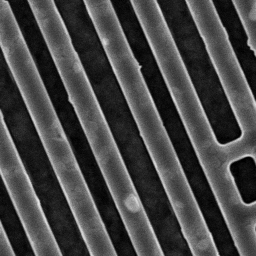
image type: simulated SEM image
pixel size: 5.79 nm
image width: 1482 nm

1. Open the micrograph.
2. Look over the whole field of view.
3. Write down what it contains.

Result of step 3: parallel lines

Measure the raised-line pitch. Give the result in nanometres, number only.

274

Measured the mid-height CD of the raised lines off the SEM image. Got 141 nanometers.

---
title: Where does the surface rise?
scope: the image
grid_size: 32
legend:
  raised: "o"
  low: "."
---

o...ooo....ooo..oooo...oooo..ooo
oo..ooo....ooo...ooo....ooo...oo
oo...ooo...oooo..oooo...ooo...oo
oo...ooo....ooo...ooo....ooo...o
ooo..oooo...oooo..oooo...ooo...o
ooo...ooo....ooo...ooo....ooo..o
oooo..oooo...oooo..ooo....ooo...
.ooo...ooo....ooo..oooo...oooo..
.oooo..ooo....oooo..ooo....ooo..
..ooo...ooo...oooo..oooo...oooo.
..ooo...ooo....ooo...ooo....ooo.
...ooo..oooo...oooo..oooo...ooo.
...ooo...ooo....ooo...ooo...oooo
...oooo..oooo...oooo..ooo....ooo
....ooo...ooo....ooo..oooo...ooo
o...oooo..ooo....ooo...ooo....oo
o....ooo...ooo....ooo..oooo...oo
oo...ooo...ooo....ooo...ooo..ooo
oo....ooo..oooo...oooo..oooooooo
oo....ooo...ooo....ooo...ooooooo
ooo...oooo..oooo...oooo..oooo...
ooo....ooo...ooo....ooo...ooo...
oooo...oooo..ooo....ooo...ooo...
.ooo....ooo...ooo....ooo..oooo..
.oooo...ooo...ooo....ooo...ooo..
..ooo....ooo..oooo...oooo..ooooo
..ooo....ooo...ooo....ooo...oooo
...ooo...oooo..oooo...oooo..oooo
...ooo....ooo...ooo....ooo...ooo
o..oooo...oooo..ooo....oooo..ooo
o...ooo....ooo...ooo....ooo..ooo
oo..oooo...ooo...ooo....ooo...oo